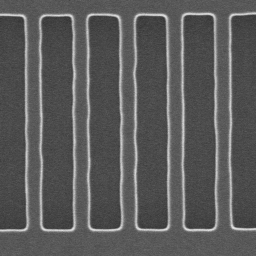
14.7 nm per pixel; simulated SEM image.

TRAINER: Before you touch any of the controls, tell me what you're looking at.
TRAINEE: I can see groups of lines, slits or small figures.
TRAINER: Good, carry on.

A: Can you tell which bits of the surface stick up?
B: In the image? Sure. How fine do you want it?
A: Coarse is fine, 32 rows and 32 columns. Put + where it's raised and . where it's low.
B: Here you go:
++++++++++++++++++++++++++++++++
++++++++++++++++++++++++++++++++
...++....++....++....++....++...
...++....++....++....++....++...
...++....++....++....++....++...
...++....++....++....++....++...
...++....++....++....++....++...
...++....++....++....++....++...
...++....++....++....++....++...
...++....++....++....++....++...
...++....++....++....++....++...
...++....++....++....++....++...
...++....++....++....++....++...
...++....++....++....++....++...
...++....++....++....++....++...
...++....++....++....++....++...
...++....++....++....++....++...
...++....++....++....++....++...
...++....++....++....++....++...
...++....++....++....++....++...
...++....++....++....++....++...
...++....++....++....++....++...
...++....++....++....++....++...
...++....++....++....++....++...
...++....++....++....++....++...
...++....++....++....++....++...
...++....++....++....++....++...
...++....++....++....++....++...
...+++...++....++....++....+++..
++++++++++++++++++++++++++++++++
++++++++++++++++++++++++++++++++
++++++++++++++++++++++++++++++++